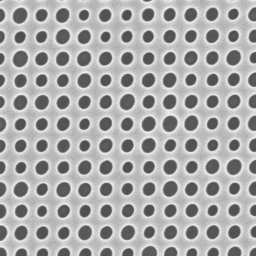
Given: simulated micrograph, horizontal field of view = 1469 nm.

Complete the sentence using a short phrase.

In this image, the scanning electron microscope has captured a regular array of holes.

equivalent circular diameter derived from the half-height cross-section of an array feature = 71.7 nanometers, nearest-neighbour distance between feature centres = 122 nm